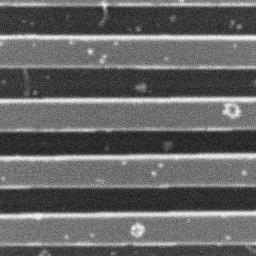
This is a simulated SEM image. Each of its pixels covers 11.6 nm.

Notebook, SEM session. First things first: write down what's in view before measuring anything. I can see lines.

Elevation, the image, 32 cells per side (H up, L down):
HHHHHHHHHHHHHHHHHHHHHHHHHHHHHHHH
LLLLLLLLLLLLLLLLLLLLLLLLLLLLLLLL
LLLLLLLLLLLLLLLLLLLLLLLLLLLLLLLL
LLLLLLLLLLLLLLLLLLLLLLLLLLLLLLLL
LLLLLLLLLLLLLLLLLLLLLLLLLLLLLLLL
HHHHHHHHHHHHHHHHHHHHHHHHHHHHHHHH
HHHHHHHHHHHHHHHHHHHHHHHHHHHHHHHH
HHHHHHHHHHHHHHHHHHHHHHHHHHHHHHHH
LLLLLLLLLLLLLLLLLLLLLLLLLLLLLLLL
LLLLLLLLLLLLLLLLLLLLLLLLLLLLLLLL
LLLLLLLLLLLLLLLLLLLLLLLLLLLLLLLL
LLLLLLLLLLLLLLLLLLLLLLLLLLLLLLLL
HHHHHHHHHHHHHHHHHHHHHHHHHHHHHHHH
HHHHHHHHHHHHHHHHHHHHHHHHHHHHHHHH
HHHHHHHHHHHHHHHHHHHHHHHHHHHHHHHH
HHHHHHHHHHHHHHHHHHHHHHHHHHHHHHHH
LLLLLLLLLLLLLLLLLLLLLLLLLLLLLLLL
LLLLLLLLLLLLLLLLLLLLLLLLLLLLLLLL
LLLLLLLLLLLLLLLLLLLLLLLLLLLLLLLL
LLLLLLLLLLHHHHHHHHHHHHHHHHHHHHHH
HHHHHHHHHHHHHHHHHHHHHHHHHHHHHHHH
HHHHHHHHHHHHHHHHHHHHHHHHHHHHHHHH
HHHHHHHHHHHHHHHHHHHHHHHHHHHHHHHH
LLLLLLLLLLLLLLLLLLLLLLLLLLLLLLLL
LLLLLLLLLLLLLLLLLLLLLLLLLLLLLLLL
LLLLLLLLLLLLLLLLLLLLLLLLLLLLLLLL
LLLLLLLLLLLLLLLLLLLLLLLLLLLHHHHH
HHHHHHHHHHHHHHHHHHHHHHHHHHHHHHHH
HHHHHHHHHHHHHHHHHHHHHHHHHHHHHHHH
HHHHHHHHHHHHHHHHHHHHHHHHHHHHHHHH
HHHHHHHHHHHHHHHHHHHHHHLLLLLHLLLL
LLLLLLLLLLLLLLLLLLLLLLLLLLLLLLLL